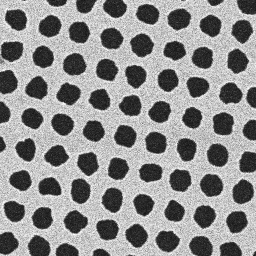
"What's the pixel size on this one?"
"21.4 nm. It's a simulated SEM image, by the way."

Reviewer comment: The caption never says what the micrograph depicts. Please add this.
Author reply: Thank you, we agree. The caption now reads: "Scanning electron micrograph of a regular array of holes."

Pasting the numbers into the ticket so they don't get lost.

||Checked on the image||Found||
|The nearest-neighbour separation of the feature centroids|653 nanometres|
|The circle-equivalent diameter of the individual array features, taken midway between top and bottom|483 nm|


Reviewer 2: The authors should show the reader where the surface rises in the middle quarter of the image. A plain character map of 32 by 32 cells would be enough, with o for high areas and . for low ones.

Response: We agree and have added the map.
......oo.....ooo...ooooooooooooo
.....ooo......o.....ooooo..ooooo
o...oooo.....oo......ooo....oooo
ooooooooo....ooo.....oo......oo.
oooooooooooooooo....ooo......oo.
...oooooooooooooo..ooooo....ooo.
....oooo..ooooooooooooooo..oooo.
....ooo....oooooooooooooooooooo.
....oo......ooo....ooooooooooooo
...ooo......oo.....oooo...oooooo
ooooooo.....oo......oo.....ooooo
ooooooooo.oooo.....oo......ooo..
ooooooooooooooo....oo......ooo..
..ooooooooooooooooooo.....ooo...
...ooo...oooooooooooooo..ooooo..
...oo.....oooo..oooooooooooooo..
..ooo.....ooo....ooooooooooooooo
.oooo.....ooo.....ooo....ooooooo
ooooo.....ooo.....oo......oooo.o
oooooooo.oooo.....oo......oo....
ooooooooooooooo..ooo......oo....
ooooooooooooooooooooo....ooo....
.ooo....ooooooooooooooooooooo...
.oo.....oooo..ooooooooooooooo...
ooo.....ooo.....oooooooooooooooo
ooo......oo.....ooo.....oooooooo
oooo....ooo.....ooo......oo....o
ooooo..oooo.....ooo......oo.....
oooooooooooo...oooo.....oo......
oo....oooooooooooooo.ooooo......
oo.....oooooooooooooooooooo....o
oo.....oooo...ooooooooooooo....o